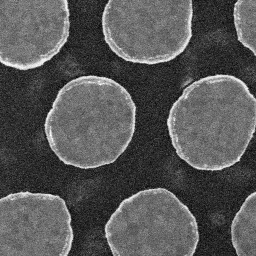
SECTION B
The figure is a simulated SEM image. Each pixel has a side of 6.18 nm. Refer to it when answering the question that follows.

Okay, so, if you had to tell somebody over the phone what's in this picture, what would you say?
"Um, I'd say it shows raised bodies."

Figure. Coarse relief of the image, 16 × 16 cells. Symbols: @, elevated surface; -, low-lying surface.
@@@@---@@@@@---@
@@@@--@@@@@@---@
@@@@---@@@@@---@
@@@-----@@@-----
----------------
----@@@@----@@@-
---@@@@@---@@@@@
---@@@@@---@@@@@
---@@@@@---@@@@@
---@@@@@---@@@@-
------------@@--
----------------
@@@@----@@@----@
@@@@---@@@@@---@
@@@@---@@@@@--@@
@@@@---@@@@@---@